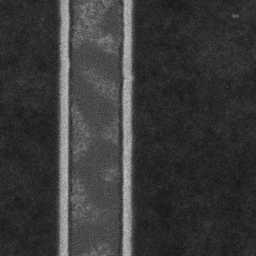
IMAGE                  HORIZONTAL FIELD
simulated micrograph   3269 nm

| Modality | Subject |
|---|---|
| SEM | one or a few lines or trenches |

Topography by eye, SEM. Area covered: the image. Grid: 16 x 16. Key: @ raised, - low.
@@@@----@@@@@@@@
@@@@----@@@@@@@@
@@@@----@@@@@@@@
@@@@----@@@@@@@@
@@@@----@@@@@@@@
@@@@----@@@@@@@@
@@@@----@@@@@@@@
@@@@----@@@@@@@@
@@@@----@@@@@@@@
@@@@----@@@@@@@@
@@@@----@@@@@@@@
@@@@----@@@@@@@@
@@@@----@@@@@@@@
@@@@----@@@@@@@@
@@@@----@@@@@@@@
@@@@----@@@@@@@@